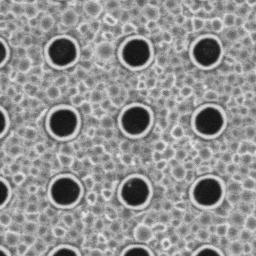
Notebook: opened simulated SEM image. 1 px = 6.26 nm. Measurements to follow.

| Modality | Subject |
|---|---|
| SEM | a regular array of raised bodies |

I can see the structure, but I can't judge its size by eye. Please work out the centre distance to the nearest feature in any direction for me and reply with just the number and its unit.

435 nanometres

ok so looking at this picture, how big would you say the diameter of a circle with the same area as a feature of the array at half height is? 205 nm